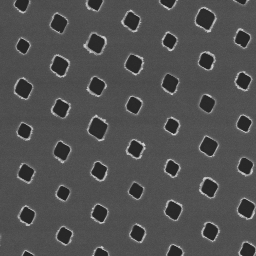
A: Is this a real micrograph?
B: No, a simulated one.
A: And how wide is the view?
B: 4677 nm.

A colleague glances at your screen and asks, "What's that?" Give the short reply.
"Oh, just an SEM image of a regular array of holes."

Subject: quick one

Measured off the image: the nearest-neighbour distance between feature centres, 765 nanometers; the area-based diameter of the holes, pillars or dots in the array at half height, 271 nanometres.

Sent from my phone